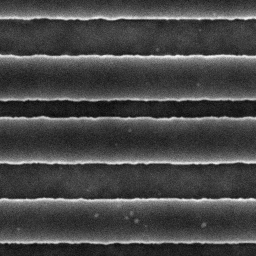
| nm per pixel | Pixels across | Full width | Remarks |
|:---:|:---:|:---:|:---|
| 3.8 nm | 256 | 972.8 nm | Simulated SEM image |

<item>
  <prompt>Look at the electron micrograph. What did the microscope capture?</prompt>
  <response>lines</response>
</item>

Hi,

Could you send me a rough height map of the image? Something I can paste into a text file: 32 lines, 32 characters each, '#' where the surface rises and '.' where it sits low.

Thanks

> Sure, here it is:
################################
################################
................................
................................
................................
................................
................................
################################
################################
################################
################################
################################
#.#......#.###....##..#.........
................................
................................
################################
################################
################################
################################
################################
................................
................................
................................
................................
................................
################################
################################
################################
################################
################################
.............#..................
................................